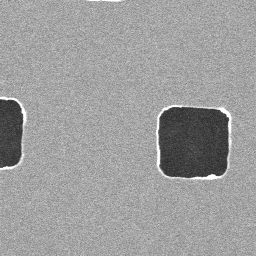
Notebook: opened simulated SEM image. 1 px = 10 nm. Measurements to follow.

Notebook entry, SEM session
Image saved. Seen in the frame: holes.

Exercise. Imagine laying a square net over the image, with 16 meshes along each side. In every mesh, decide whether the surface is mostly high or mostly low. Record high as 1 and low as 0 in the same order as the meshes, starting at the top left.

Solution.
1111111111111111
1111111111111111
1111111111111111
1111111111111111
1111111111111111
1111111111111111
0111111111111111
0111111111000011
0111111111000011
0111111111000011
1111111111000011
1111111111111111
1111111111111111
1111111111111111
1111111111111111
1111111111111111